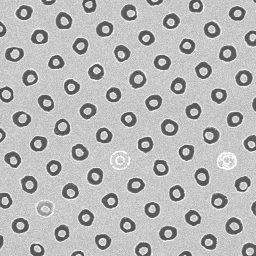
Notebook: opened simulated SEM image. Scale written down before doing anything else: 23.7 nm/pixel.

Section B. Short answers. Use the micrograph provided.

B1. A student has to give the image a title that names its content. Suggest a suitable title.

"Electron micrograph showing a regular array of ring-shaped grooves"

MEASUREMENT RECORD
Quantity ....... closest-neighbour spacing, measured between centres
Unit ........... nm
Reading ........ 679